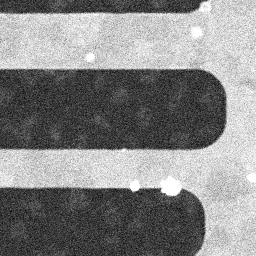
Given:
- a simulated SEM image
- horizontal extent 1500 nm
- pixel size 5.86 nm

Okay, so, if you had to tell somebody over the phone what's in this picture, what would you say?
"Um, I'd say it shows one or a few lines or trenches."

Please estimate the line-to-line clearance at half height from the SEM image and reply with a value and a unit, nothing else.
482 nanometres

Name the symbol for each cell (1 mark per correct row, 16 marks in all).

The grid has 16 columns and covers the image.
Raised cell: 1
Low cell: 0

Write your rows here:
0000000000001111
1111111111111111
1111111111111111
1111111111111111
0000000000000111
0000000000000011
0000000000000011
0000000000000011
0000000000000011
1111111111111111
1111111111111111
1111111111111111
0000000000001111
0000000000000111
0000000000000111
0000000000000111